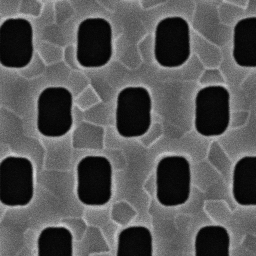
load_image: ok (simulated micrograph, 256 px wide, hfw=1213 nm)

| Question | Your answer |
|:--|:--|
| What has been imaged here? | holes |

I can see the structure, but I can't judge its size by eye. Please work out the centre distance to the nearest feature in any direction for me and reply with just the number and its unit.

374 nanometers